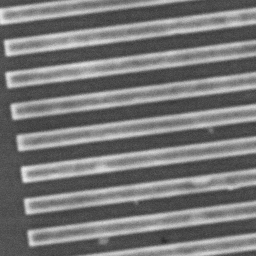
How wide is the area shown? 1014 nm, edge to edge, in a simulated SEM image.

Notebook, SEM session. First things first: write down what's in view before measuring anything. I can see parallel lines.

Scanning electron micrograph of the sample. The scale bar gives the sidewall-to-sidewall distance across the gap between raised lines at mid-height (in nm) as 70.7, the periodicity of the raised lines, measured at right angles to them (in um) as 0.127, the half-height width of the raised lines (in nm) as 57.5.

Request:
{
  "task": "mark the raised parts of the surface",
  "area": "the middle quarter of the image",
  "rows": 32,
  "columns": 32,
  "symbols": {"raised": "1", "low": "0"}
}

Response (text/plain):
01111111111111111111111111000000
11111111111111111100000000000000
11111111111000000000000000000000
11100000000000000000000000000000
00000000000000000000000000000001
00000000000000000000000011111111
00000000000000001111111111111111
00000000111111111111111111111111
11111111111111111111111111100000
11111111111111111111000000000000
11111111111100000000000000000000
11110000000000000000000000000000
00000000000000000000000000000001
00000000000000000000000111111111
00000000000000001111111111111111
00000000111111111111111111111111
11111111111111111111111111100000
11111111111111111110000000000000
11111111111100000000000000000000
11110000000000000000000000000000
00000000000000000000000000000000
00000000000000000000000001111111
00000000000000000111111111111111
00000000011111111111111111111111
00111111111111111111111111111000
11111111111111111110000000000000
11111111111000000000000000000000
11111000000000000000000000000000
00000000000000000000000000000000
00000000000000000000000011111111
00000000000000000111111111111111
00000000011111111111111111111111